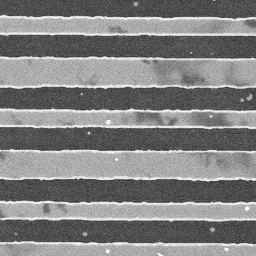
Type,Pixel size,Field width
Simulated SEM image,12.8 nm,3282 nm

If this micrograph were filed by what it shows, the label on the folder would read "lines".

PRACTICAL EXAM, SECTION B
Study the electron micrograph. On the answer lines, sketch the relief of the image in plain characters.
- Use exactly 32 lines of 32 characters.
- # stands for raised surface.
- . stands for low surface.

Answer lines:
................................
................................
################################
################################
................................
................................
................................
################################
################################
################################
################################
................................
................................
................................
################################
################################
................................
................................
................................
################################
################################
################################
........................####...#
................................
................................
################################
################################
................................
................................
................................
################################
################################